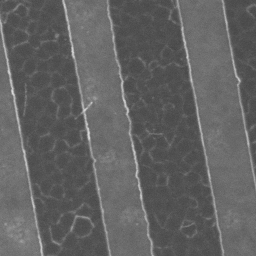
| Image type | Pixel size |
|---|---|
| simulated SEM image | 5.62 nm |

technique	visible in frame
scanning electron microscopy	one or a few lines or trenches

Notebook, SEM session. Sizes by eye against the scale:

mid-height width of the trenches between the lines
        0.234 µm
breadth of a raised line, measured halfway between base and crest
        67.6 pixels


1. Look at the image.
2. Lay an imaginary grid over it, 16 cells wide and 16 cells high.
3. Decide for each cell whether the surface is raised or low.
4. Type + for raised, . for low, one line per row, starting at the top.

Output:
++++...++++...++
++++...++++...++
++++...+++++..++
+++++..+++++...+
.++++..+++++...+
.++++...++++...+
.++++...++++...+
.++++...++++...+
.+++++..+++++..+
.+++++..+++++...
..++++...++++...
..++++...++++...
..++++...++++...
..++++...+++++..
..+++++..+++++..
...++++..+++++..